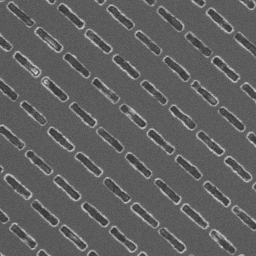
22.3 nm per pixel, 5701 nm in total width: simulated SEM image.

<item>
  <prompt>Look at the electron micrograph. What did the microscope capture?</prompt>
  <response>a regular array of holes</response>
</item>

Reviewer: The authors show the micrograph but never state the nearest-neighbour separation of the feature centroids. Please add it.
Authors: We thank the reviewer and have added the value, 0.718 micrometres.